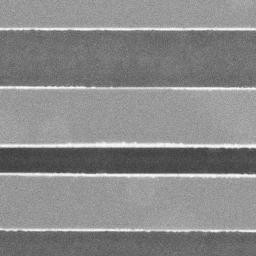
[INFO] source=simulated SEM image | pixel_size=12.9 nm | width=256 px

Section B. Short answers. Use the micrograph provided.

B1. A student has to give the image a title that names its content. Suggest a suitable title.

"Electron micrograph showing lines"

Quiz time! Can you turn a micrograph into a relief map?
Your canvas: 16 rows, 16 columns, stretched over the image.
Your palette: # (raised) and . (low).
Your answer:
################
################
................
................
................
######..........
################
################
################
................
................
################
################
################
................
................